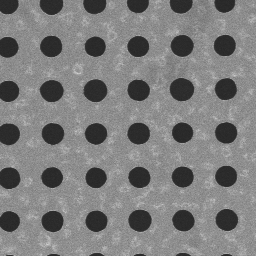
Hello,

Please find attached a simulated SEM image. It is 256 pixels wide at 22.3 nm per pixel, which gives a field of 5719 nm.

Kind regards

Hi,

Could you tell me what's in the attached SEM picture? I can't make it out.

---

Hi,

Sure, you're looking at a regular array of holes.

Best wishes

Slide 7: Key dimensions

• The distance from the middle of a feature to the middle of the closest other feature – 964 nanometers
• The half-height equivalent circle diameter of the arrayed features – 492 nanometers